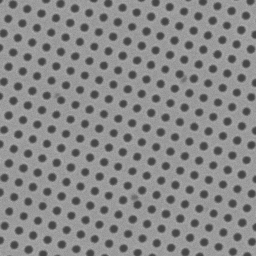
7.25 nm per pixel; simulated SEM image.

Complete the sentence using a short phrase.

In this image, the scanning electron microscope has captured a regular array of holes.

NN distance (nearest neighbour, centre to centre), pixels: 14.9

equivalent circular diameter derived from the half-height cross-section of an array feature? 0.0601 um